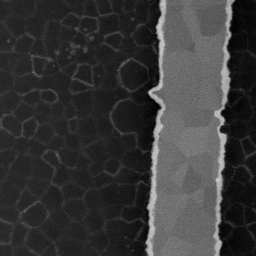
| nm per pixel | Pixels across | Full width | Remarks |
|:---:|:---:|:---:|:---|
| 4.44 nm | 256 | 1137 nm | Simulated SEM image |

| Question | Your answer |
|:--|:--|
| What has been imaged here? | one or a few lines or trenches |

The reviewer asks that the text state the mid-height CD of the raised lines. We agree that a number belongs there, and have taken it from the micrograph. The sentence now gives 66.3 pixels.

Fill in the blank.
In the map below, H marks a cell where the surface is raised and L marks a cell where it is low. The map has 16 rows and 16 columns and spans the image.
LLLLLLLLLLHHHHLL
LLLLLLLLLLHHHHLL
LLLLLLLLLLHHHHLL
LLLLLLLLLLHHHHLL
LLLLLLLLLLHHHHLL
LLLLLLLLLLHHHHLL
LLLLLLLLLLHHHHLL
LLLLLLLLLLHHHHLL
LLLLLLLLLLHHHHLL
LLLLLLLLLLHHHHLL
LLLLLLLLLLHHHHLL
LLLLLLLLLLHHHHLL
LLLLLLLLLLHHHHLL
LLLLLLLLLHHHHHLL
LLLLLLLLLHHHHHLL
LLLLLLLLLHHHHHLL